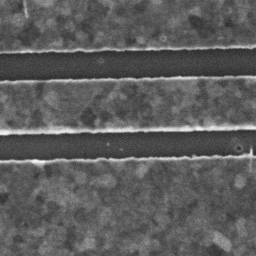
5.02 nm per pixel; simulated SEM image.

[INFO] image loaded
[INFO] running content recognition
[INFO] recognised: lines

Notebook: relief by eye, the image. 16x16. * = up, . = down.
****************
****************
****************
................
................
****************
****************
****************
................
................
****************
****************
****************
****************
****************
****************